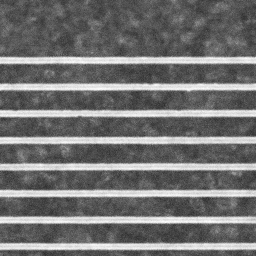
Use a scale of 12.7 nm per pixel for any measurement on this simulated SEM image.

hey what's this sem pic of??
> parallel lines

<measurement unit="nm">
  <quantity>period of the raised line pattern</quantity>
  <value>338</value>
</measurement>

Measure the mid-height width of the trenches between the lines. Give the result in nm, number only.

275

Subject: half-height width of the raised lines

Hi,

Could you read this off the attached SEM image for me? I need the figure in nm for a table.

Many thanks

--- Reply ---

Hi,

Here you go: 62.1